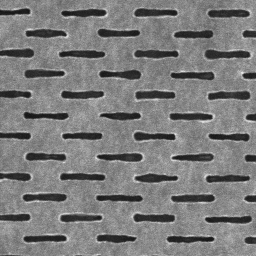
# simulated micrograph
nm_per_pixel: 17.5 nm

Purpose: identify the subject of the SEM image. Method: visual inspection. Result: a regular array of holes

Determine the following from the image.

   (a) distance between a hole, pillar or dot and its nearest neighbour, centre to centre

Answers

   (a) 692 nanometers